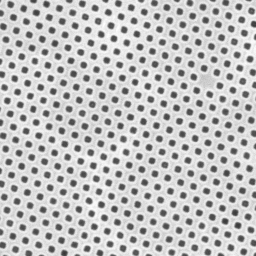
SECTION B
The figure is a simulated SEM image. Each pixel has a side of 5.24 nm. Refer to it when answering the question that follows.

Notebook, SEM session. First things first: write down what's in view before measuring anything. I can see a regular array of holes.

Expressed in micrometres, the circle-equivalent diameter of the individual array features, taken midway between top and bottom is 0.0405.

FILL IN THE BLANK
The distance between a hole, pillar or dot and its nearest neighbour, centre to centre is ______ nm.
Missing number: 68.7